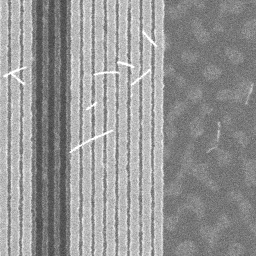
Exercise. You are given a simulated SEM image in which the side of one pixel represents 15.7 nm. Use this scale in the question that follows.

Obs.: parallel lines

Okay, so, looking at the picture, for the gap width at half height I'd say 0.0608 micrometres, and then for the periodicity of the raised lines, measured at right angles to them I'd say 188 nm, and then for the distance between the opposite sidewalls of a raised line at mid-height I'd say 126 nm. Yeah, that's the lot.